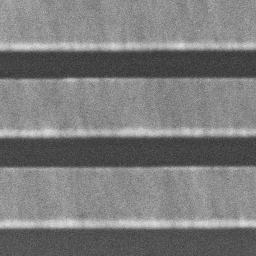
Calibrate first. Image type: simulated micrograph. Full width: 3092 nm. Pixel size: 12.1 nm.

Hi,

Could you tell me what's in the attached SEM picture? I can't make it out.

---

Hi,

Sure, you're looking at lines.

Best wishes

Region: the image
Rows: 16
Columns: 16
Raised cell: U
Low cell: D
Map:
UUUUUUUUUUUUUUUU
UUUUUUUUUUUUUUUU
UUUUUUUUUUUUUUUU
DDDDDDDDDDDDDDDD
DDDDDDDDDDDDDDDD
UUUUUUUUUUUUUUUU
UUUUUUUUUUUUUUUU
UUUUUUUUUUUUUUUU
UUDDDDDDDDDDDDDD
DDDDDDDDDDDDDDDD
DDDDDDDDDUUUUUUU
UUUUUUUUUUUUUUUU
UUUUUUUUUUUUUUUU
UUUUUUUUUUUUUUUU
DDDDDDDDDDDDDDDD
DDDDDDDDDDDDDDDD